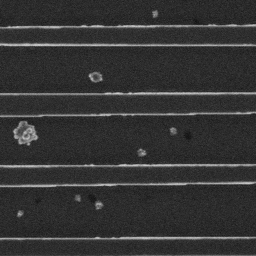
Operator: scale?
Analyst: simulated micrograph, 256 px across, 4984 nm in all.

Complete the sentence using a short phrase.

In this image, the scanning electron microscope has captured lines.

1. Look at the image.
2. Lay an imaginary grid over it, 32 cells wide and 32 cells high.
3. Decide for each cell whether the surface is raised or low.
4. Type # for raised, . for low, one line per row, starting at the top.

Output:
................................
................................
................................
################################
################################
################################
................................
................................
................................
................................
................................
................................
################################
################################
######..........................
................................
...#............................
................................
................................
................................
................................
################################
################################
................................
................................
................................
................................
................................
................................
................................
################################
################################